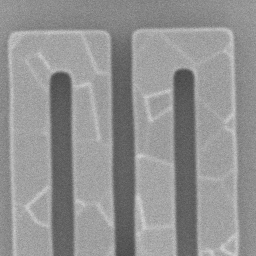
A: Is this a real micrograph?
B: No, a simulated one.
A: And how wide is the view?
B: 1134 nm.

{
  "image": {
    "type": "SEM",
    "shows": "groups of lines, slits or small figures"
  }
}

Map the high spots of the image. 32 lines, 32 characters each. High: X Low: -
--------------------------------
--------------------------------
--------------------------------
--------------------------------
-XXXXXXXXXXXXX---XXXXXXXXXXXX---
-XXXXXXXXXXXXX---XXXXXXXXXXXX---
-XXXXXXXXXXXXX---XXXXXXXXXXXX---
-XXXXXXXXXXXXX---XXXXXXXXXXXX---
-XXXXXXXXXXXXX---XXXXXXXXXXXX---
-XXXXX---XXXXX---XXXXX--XXXXX---
-XXXXX---XXXXX---XXXXX--XXXXX---
-XXXXX---XXXXX---XXXXX--XXXXX---
-XXXXX---XXXXX---XXXXX--XXXXX---
-XXXXX---XXXXX---XXXXX--XXXXX---
-XXXXX---XXXXX---XXXXX---XXXX---
-XXXXX---XXXXX---XXXXX---XXXX---
-XXXXX---XXXXX---XXXXX---XXXX---
-XXXXX---XXXXX---XXXXX---XXXX---
-XXXXX---XXXXX---XXXXX---XXXX---
-XXXXX---XXXXX---XXXXX---XXXX---
-XXXXX---XXXXX---XXXXX---XXXX---
-XXXXX---XXXXX---XXXXX---XXXX---
--XXXX---XXXXX---XXXXX---XXXX---
--XXXX---XXXXX---XXXXX---XXXX---
--XXXX---XXXXX---XXXXX---XXXX---
--XXXX---XXXXX---XXXXX---XXXX---
--XXXX---XXXXX---XXXXX---XXXXX--
--XXXX---XXXXX---XXXXX---XXXXX--
--XXXX---XXXXX---XXXXX---XXXXX--
--XXXX---XXXXX---XXXXX---XXXXX--
--XXXX---XXXXX---XXXXX---XXXXX--
--XXXX---XXXXX---XXXXX---XXXXX--